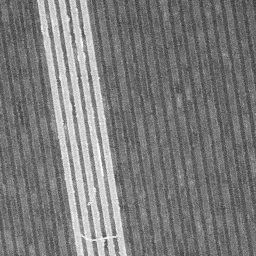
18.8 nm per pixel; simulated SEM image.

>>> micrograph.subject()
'parallel lines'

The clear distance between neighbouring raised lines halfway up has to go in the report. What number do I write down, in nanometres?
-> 105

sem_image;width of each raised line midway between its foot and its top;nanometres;93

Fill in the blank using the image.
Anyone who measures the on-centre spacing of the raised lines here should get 199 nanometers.